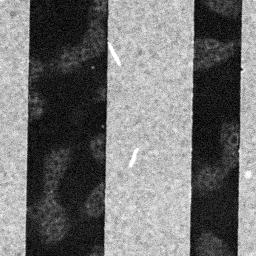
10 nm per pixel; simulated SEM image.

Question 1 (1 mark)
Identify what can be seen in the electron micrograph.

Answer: one or a few lines or trenches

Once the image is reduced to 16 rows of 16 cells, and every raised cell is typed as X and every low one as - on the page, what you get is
XX-----XXXXX---X
XX-----XXXXX---X
XX-----XXXXX---X
XX-----XXXXX---X
XX-----XXXXX---X
XX-----XXXXX---X
XX-----XXXXX---X
XX-----XXXXX---X
XX-----XXXXX---X
XX-----XXXXX---X
XX-----XXXXX---X
XX-----XXXXX---X
XX-----XXXXX---X
XX-----XXXXX---X
XX-----XXXXX---X
XX-----XXXXX---X